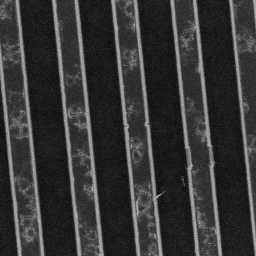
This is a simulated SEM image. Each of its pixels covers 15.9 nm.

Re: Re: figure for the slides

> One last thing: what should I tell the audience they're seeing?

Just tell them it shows parallel lines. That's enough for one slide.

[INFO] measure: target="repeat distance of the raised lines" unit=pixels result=59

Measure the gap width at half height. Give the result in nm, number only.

564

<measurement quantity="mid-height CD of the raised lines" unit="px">23.5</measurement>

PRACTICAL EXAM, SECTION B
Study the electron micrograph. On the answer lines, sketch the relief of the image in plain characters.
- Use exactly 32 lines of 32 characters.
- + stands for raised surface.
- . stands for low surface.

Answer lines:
++.....+++....+++.....++.....+++
++.....+++....+++.....++.....+++
++.....+++....+++.....+++....+++
+++....+++....+++.....+++....+++
+++....+++.....++.....+++....+++
+++....+++.....++.....+++....+++
+++....+++.....+++....+++....+++
+++....+++.....+++....+++.....++
+++.....++.....+++....+++.....++
+++.....+++....+++....+++.....++
+++.....+++....+++.....++.....++
+++.....+++....+++.....+++....++
.++.....+++....+++.....+++....++
.+++....+++....+++.....+++....++
.+++....+++.....++.....+++....++
.+++....+++.....++.....+++....++
.+++....+++.....+++....+++....++
.+++....+++.....+++....+++.....+
.+++.....++.....+++....+++.....+
.+++.....+++....+++.....++.....+
.+++.....+++....+++.....+++....+
.+++.....+++....+++.....++.....+
..++.....+++....+++.....+++....+
..+++....+++....+++.....+++....+
..+++....+++.....+++....+++....+
..+++....+++.....++.....+++....+
..+++....+++.....+++....+++....+
..+++....+++.....+++....+++.....
..+++.....++.....+++....+++.....
..+++.....+++....+++....+++.....
..+++.....+++....+++.....++.....
..+++.....+++....+++.....++.....